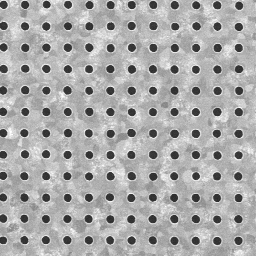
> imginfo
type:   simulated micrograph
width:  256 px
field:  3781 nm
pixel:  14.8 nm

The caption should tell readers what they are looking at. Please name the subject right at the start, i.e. a regular array of holes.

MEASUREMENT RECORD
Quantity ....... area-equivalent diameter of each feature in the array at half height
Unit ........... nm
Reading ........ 128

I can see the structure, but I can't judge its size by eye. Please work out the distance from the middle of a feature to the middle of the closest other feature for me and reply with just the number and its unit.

311 nm